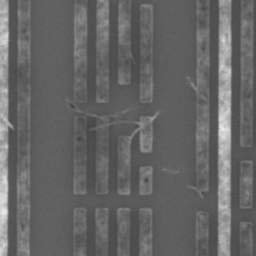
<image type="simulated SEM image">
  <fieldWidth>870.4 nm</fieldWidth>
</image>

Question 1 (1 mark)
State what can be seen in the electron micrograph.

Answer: groups of lines, slits or small figures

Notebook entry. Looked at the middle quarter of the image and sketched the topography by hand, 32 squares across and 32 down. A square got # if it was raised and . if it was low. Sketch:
...##...###...##...###..........
...##...###...##...###..........
...##...###...##...###..........
...##...###...##...###..........
...##...###...##...###..........
...##...###........###..........
...##...###........###..........
...##...###........###..........
...##...###........###..........
................................
................................
................................
................................
...##...###........###..........
...##...###........###..........
...##...###........###..........
...##...###........###..........
...##...###........###..........
...##...###...###..###..........
...##...###...###..###..........
...##...###...##...###..........
...##...###...##...###..........
...##...###...##................
...##...###...##................
...##...###...##................
...##...###...##................
...##...###...##...###..........
...##...###...##...###..........
...##...###...##...#.#..........
...##...###...##...#.#..........
...##...###...##...###..........
...##...###...##...###..........